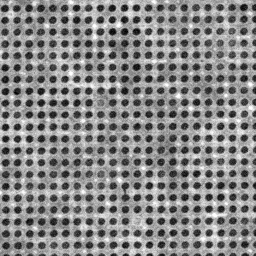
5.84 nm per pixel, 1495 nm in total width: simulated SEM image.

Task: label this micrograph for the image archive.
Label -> a regular array of holes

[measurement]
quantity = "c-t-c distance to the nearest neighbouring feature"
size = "67.7 nm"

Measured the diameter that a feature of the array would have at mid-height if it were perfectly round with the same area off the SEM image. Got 0.047 um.